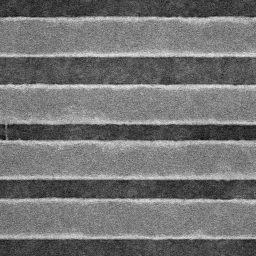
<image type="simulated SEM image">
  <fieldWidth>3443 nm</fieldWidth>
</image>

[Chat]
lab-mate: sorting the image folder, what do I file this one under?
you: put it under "lines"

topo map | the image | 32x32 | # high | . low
................................
................................
################################
################################
################################
################################
################################
................................
................................
................................
................................
################################
################################
################################
################################
..................#...........##
................................
#...............................
################################
################################
################################
################################
................................
................................
................................
################################
################################
################################
################################
################################
................................
................................